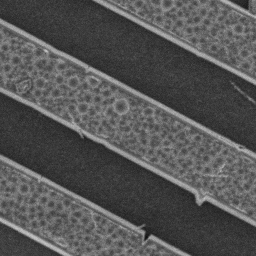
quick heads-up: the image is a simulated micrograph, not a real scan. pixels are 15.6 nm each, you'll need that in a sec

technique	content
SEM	one or a few lines or trenches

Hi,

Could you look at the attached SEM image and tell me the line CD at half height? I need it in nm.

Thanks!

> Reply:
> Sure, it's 935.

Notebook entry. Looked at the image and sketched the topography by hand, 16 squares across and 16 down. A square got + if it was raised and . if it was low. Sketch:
.......++++++++.
.........+++++++
++.........+++++
++++.........+++
++++++.........+
++++++++........
..++++++++......
....++++++++....
......++++++++..
........+++++++.
+........+++++++
+++........+++++
+++++........+++
+++++++........+
..+++++++.......
...++++++++.....